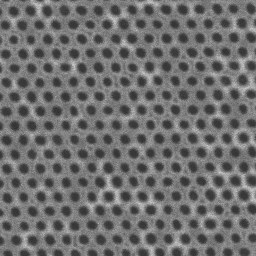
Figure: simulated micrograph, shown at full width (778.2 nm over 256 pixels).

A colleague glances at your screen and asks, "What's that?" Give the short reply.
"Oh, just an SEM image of a regular array of holes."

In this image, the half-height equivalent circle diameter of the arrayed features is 29.7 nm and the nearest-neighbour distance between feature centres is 16.3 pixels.